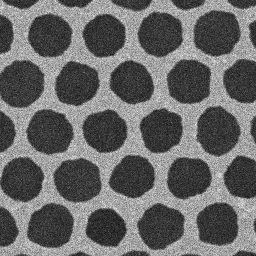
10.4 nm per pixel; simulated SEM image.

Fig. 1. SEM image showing a regular array of holes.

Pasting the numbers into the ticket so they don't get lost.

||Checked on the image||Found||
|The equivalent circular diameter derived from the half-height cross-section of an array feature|0.464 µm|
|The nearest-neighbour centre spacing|571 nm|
